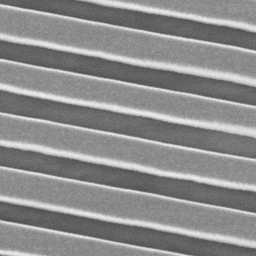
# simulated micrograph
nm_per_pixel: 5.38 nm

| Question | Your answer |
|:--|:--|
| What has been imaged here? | lines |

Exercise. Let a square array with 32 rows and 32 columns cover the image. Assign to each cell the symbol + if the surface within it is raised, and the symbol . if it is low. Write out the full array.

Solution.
.............+++++++++++++++++++
+++++.............++++++++++++++
+++++++++++.............++++++++
++++++++++++++++..............++
+++++++++++++++++++++...........
....++++++++++++++++++++++++....
.........+++++++++++++++++++++++
+.............++++++++++++++++++
++++++..............++++++++++++
+++++++++++...............++++++
+++++++++++++++++..............+
..++++++++++++++++++++..........
.......+++++++++++++++++++++....
.............+++++++++++++++++++
++................++++++++++++++
++++++++...............+++++++++
+++++++++++++................+++
+++++++++++++++++++.............
..++++++++++++++++++++++........
........+++++++++++++++++++++...
.............+++++++++++++++++++
++++..............++++++++++++++
+++++++++...............++++++++
++++++++++++++...............+++
++++++++++++++++++++............
...+++++++++++++++++++++++......
........+++++++++++++++++++++++.
.............+++++++++++++++++++
+++++..............+++++++++++++
+++++++++++.............++++++++
++++++++++++++++..............++
+++++++++++++++++++++...........